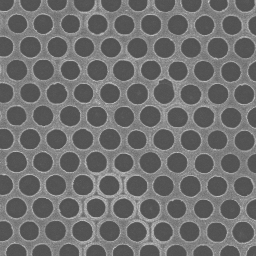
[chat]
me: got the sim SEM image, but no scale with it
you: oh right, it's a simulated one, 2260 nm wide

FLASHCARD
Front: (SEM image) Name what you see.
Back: a regular array of holes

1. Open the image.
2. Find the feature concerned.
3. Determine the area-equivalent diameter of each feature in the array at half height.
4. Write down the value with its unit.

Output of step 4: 0.176 micrometres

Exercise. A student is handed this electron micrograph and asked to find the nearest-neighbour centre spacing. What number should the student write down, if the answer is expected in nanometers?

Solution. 231